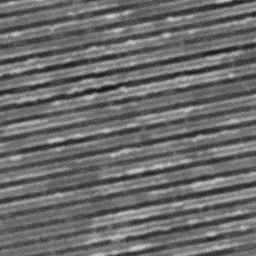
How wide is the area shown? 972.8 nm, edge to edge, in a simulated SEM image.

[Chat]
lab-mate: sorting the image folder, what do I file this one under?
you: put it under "parallel lines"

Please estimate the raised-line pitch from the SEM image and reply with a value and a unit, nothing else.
57.7 nanometres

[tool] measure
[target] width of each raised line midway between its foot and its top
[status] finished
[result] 0.0304 micrometres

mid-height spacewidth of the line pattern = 26.2 nm